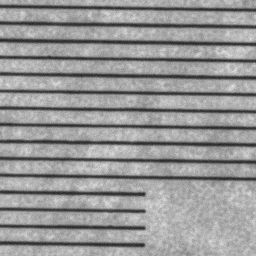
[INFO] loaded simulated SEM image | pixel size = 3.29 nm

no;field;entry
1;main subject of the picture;parallel lines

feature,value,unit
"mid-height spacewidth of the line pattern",0.014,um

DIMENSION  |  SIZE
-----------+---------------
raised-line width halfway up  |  42.3 nanometres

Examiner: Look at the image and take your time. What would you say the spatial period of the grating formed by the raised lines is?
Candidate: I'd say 55.6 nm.